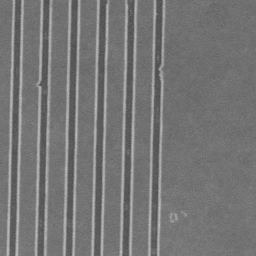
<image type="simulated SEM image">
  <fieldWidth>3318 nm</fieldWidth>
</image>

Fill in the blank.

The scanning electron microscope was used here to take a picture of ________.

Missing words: parallel lines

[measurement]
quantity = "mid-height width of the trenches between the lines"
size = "112 nm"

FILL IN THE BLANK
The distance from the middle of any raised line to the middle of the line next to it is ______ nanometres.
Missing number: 367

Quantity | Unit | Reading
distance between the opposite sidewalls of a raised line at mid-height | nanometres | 244